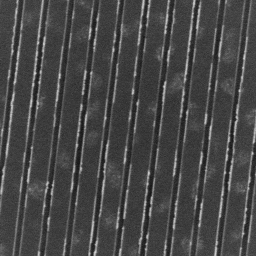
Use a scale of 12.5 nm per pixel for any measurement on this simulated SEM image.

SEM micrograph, parallel lines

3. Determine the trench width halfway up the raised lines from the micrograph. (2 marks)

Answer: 0.0731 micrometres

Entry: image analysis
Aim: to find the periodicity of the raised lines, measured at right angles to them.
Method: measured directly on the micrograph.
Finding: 0.314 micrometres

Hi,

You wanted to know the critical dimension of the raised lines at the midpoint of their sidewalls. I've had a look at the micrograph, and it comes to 243 nanometres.